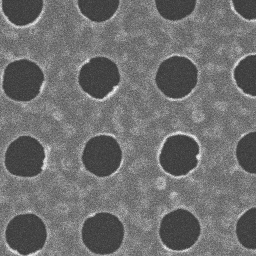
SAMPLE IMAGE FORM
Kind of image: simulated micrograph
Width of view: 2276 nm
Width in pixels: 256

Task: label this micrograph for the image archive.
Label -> a regular array of holes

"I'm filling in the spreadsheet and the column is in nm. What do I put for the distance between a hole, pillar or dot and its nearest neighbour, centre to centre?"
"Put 682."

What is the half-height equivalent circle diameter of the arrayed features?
367 nanometres